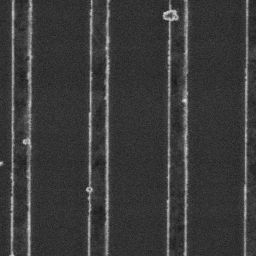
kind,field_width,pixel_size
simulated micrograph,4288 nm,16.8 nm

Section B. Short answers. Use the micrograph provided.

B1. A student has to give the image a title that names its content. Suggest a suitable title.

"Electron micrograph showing lines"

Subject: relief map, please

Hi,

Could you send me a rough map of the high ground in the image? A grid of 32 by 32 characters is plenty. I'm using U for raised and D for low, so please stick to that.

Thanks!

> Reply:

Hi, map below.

DDUUDDDDDDDUUDDDDDDDDUUDDDDDDDDU
DDUUDDDDDDDUUDDDDDDDDUUDDDDDDDDU
DDUUDDDDDDDUUDDDDDDDDUUDDDDDDDDU
DDUUDDDDDDDUUDDDDDDDDUUDDDDDDDDU
DDUUDDDDDDDUUDDDDDDDDUUDDDDDDDDU
DDUUDDDDDDDUUDDDDDDDDUUDDDDDDDDU
DDUUDDDDDDDUUDDDDDDDDUUDDDDDDDDU
DDUUDDDDDDDUUDDDDDDDDUUDDDDDDDDU
DDUUDDDDDDDUUDDDDDDDDUUDDDDDDDDU
DDUUDDDDDDDUUDDDDDDDDUUDDDDDDDDU
DDUUDDDDDDDUUDDDDDDDDUUDDDDDDDDU
DDUUDDDDDDDUUDDDDDDDDUUDDDDDDDDU
DDUUDDDDDDDUUDDDDDDDDUUDDDDDDDDU
DDUUDDDDDDDUUDDDDDDDDUUDDDDDDDDU
DDUUDDDDDDDUUDDDDDDDDUUDDDDDDDDU
DDUUDDDDDDDUUDDDDDDDDUUDDDDDDDDU
DDUUDDDDDDDUUDDDDDDDDUUDDDDDDDDU
DDUUDDDDDDDUUDDDDDDDDUUDDDDDDDDU
DDUUDDDDDDDUUDDDDDDDDUUDDDDDDDDU
DDUUDDDDDDDUUDDDDDDDDUUDDDDDDDDU
DDUUDDDDDDDUUDDDDDDDDUUDDDDDDDDU
DDUUDDDDDDDUUDDDDDDDDUUDDDDDDDDU
DDUUDDDDDDDUUDDDDDDDDUUDDDDDDDDU
DDUUDDDDDDDUUDDDDDDDDUUDDDDDDDDU
DDUUDDDDDDDUUDDDDDDDDUUDDDDDDDDU
DDUUDDDDDDDUUDDDDDDDDUUDDDDDDDDU
DDUUDDDDDDDUUDDDDDDDDUUDDDDDDDDU
DUUUDDDDDDDUUDDDDDDDDUUDDDDDDDDU
DUUUDDDDDDDUUDDDDDDDDUUDDDDDDDDU
DUUUDDDDDDDUUDDDDDDDDUUDDDDDDDDU
DUUUDDDDDDDUUDDDDDDDDUUDDDDDDDDU
DUUUDDDDDDDUUDDDDDDDDUUDDDDDDDDU